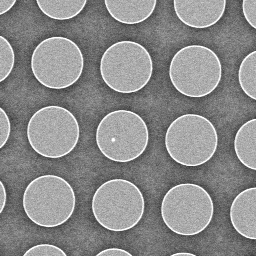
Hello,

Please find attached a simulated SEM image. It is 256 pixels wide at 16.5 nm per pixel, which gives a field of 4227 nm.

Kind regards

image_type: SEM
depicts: an array of small figures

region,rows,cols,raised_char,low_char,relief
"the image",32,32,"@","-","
@@---@@@@@@--@@@@@@---@@@@@@--@@
@----@@@@@----@@@@@---@@@@@@--@@
---------------@@@-----@@@@----@
--------------------------------
--------------------------------
@----@@@@-----@@@---------------
@@--@@@@@@---@@@@@----@@@@@-----
@@--@@@@@@---@@@@@@---@@@@@---@@
@@--@@@@@@---@@@@@@--@@@@@@@--@@
@---@@@@@@---@@@@@@--@@@@@@@--@@
-----@@@@----@@@@@----@@@@@---@@
---------------@@------@@@-----@
--------------------------------
------@@------------------------
@---@@@@@----@@@@------@@-------
@---@@@@@@--@@@@@@---@@@@@-----@
@--@@@@@@@--@@@@@@---@@@@@@---@@
@---@@@@@@--@@@@@@---@@@@@@--@@@
----@@@@@---@@@@@@---@@@@@@--@@@
------@@-----@@@@----@@@@@----@@
-----------------------@@-----@@
--------------------------------
----@@@@------@-----------------
@--@@@@@@---@@@@@-----@@@-------
@--@@@@@@---@@@@@@---@@@@@----@@
@--@@@@@@---@@@@@@--@@@@@@@--@@@
---@@@@@@---@@@@@@--@@@@@@@--@@@
----@@@@----@@@@@---@@@@@@---@@@
-------------@@@-----@@@@@---@@@
------------------------------@@
--------------------------------
---@@@@@-----@@@----------------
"